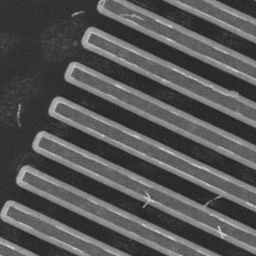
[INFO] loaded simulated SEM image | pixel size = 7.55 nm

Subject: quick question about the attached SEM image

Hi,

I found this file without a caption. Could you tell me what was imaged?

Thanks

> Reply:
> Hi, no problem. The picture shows parallel lines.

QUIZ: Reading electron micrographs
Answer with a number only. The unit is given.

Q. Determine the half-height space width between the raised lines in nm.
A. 158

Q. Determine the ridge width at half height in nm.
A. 129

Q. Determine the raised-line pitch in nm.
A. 287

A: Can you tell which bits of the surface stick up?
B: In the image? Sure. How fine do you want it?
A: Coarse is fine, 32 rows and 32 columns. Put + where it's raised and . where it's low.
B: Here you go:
............++++......+++++.....
.............+++++......+++++...
...............+++++.......+++++
.................+++++.......+++
...........++......++++++......+
...........+++++......+++++.....
............++++++......+++++...
...............+++++......+++++.
.........+.......+++++......++++
........+++++......+++++......++
..........+++++......+++++......
............+++++......+++++....
.......+......+++++......++++++.
.......+++......+++++......+++++
.......+++++......+++++.......++
.........+++++......+++++.......
...........+++++.......+++++....
.....++......+++++.......+++++..
.....++++......++++++......+++++
.......++++.......+++++......+++
.........+++++......+++++......+
...++......+++++......+++++.....
..+++++......+++++......+++++...
....+++++......+++++......+++++.
......+++++......+++++......++++
.+......+++++......+++++.......+
++++......+++++......+++++......
.+++++......+++++.......+++++...
...+++++......++++++......+++++.
.....+++++......++++++......++++
+......++++++......+++++......++
+++.......+++++......+++++......